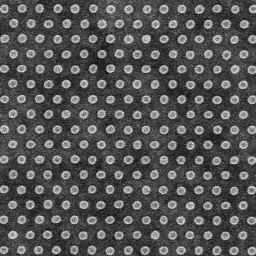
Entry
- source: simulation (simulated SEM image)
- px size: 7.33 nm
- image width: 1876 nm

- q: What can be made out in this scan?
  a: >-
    a regular array of raised bodies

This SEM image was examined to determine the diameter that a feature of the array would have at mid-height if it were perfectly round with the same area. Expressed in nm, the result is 59.1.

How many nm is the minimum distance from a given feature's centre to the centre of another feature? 125